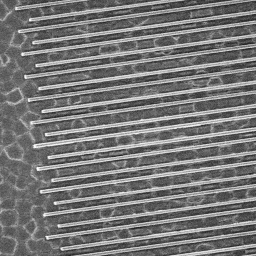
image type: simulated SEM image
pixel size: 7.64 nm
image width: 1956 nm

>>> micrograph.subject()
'parallel lines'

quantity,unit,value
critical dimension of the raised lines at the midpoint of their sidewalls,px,2.59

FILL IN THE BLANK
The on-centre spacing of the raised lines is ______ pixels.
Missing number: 11.6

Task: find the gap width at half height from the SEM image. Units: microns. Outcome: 0.0596